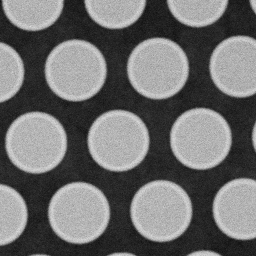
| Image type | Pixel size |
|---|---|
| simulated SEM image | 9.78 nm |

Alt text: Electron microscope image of an array of small figures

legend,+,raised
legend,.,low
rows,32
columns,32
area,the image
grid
++++++++...+++++++...+++++++...+
.+++++++...+++++++...+++++++....
.++++++.....+++++.....+++++.....
...+++.......++.................
.............................+..
+......++++......+++++.....+++++
++....++++++....+++++++....+++++
+++...+++++++...+++++++...++++++
+++...+++++++...++++++++..++++++
+++...+++++++...+++++++...++++++
+++...+++++++...+++++++....+++++
++.....+++++.....+++++......++++
+.......++......................
................................
...+++.......++++......+++++....
.+++++++....++++++....++++++....
.+++++++...+++++++...++++++++...
.+++++++...++++++++..++++++++...
.+++++++...++++++++..++++++++...
.+++++++...+++++++....++++++....
..+++++.....+++++......++++.....
...+++..........................
.............................+++
+.......++++......+++++.....++++
+++....++++++....++++++....+++++
+++...++++++++..++++++++...+++++
+++...++++++++..++++++++...+++++
+++...++++++++...+++++++...+++++
+++....++++++....++++++....+++++
++.....+++++......++++.......+++
+...............................
........................+++.....